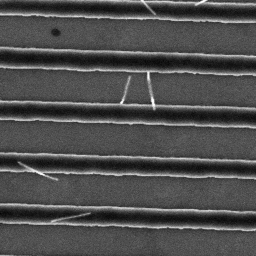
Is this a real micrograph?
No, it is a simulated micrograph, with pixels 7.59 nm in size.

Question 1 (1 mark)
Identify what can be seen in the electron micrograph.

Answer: lines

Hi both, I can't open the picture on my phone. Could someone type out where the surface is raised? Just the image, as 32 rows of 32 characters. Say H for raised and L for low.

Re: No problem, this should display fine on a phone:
HHHHHHHHHHHHHHHHHHHHHHHHHHHHHHLH
HHHHHHHHHHHHHHHHHHHHHHHHHHHHHHHH
LLLLLLLLLLLLLLLLLLLLLHHHHHHHHHHH
LLLLLLLLLLLLLLLLLLLLLLLLLLLLLLLL
LLLLLLLLLLLLLLLLLLLLLLLLLLLLLLLL
LLLLLLLLLLLLLLLLLLLLLLLLLLLLLLLL
HHHHHHHHHHHHHHHHHHLLLLLLLLLLLLLL
HHHHHHHHHHHHHHHHHHHHHHHHHHHHHHHH
LLLLLHHHHHHHHHHHHHHHHHHHHHHHHHHH
LLLLLLLLLLLLLLLLLLLLLLLLLLLLLLLL
LLLLLLLLLLLLLLLLLLLLLLLLLLLLLLLL
LLLLLLLLLLLLLLLLLLLLLLLLLLLLLLLL
LLLLLLLLLLLLLLLLLLLLLLLLLLLLLLLL
HHHHHHHHHHHHHHHHHHHHHHHHHHHHHLLL
HHHHHHHHHHHHHHHHHHHHHHHHHHHHHHHH
LLLLLLLLLLLLLLLLLLLLHHHHHHHHHHHH
LLLLLLLLLLLLLLLLLLLLLLLLLLLLLLLL
LLLLLLLLLLLLLLLLLLLLLLLLLLLLLLLL
LLLLLLLLLLLLLLLLLLLLLLLLLLLLLLLL
HHHHHHHHHHHHHLLLLLLLLLLLLLLLLLLL
HHHHHHHHHHHHHHHHHHHHHHHHHHHHHHHH
LLLLHHHHHHHHHHHHHHHHHHHHHHHHHHHH
LLLLLLLLLLLLLLLLLLLLLLLLLLLLLLLL
LLLLLLLLLLLLLLLLLLLLLLLLLLLLLLLL
LLLLLLLLLLLLLLLLLLLLLLLLLLLLLLLL
LLLLLLLLLLLLLLLLLLLLLLLLLLLLLLLL
HHHHHHHHHHHHHHHHHHHHHHHHHHHHHHHH
HHHHHHHHHHHHHHHHHHHHHHHHHHHHHHHH
LLLLLLLLLLLLLLLLLLLLLLHLHHHHHHHH
LLLLLLLLLLLLLLLLLLLLLLLLLLLLLLLL
LLLLLLLLLLLLLLLLLLLLLLLLLLLLLLLL
LLLLLLLLLLLLLLLLLLLLLLLLLLLLLLLL